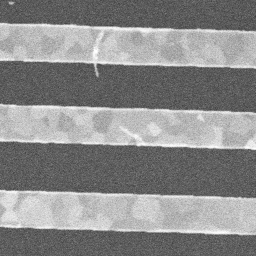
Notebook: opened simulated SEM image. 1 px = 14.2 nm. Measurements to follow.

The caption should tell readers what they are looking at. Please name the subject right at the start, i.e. lines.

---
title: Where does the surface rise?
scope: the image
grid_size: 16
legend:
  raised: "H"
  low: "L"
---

LLLLLLLLLLLLLLLL
LLLLLLLLLLLLLLLL
HHHHHHHHHHHHHHHH
HHHHHHHHHHHHHHHH
LLLLLLLLLLLLLLLL
LLLLLLLLLLLLLLLL
LLLLLLLLLLLLLLLL
HHHHHHHHHHHHHHHH
HHHHHHHHHHHHHHHH
LLLLLLLLLLLLLLLL
LLLLLLLLLLLLLLLL
LLLLLLLLLLLLLLLL
HHHHHHHHHHHHHHHH
HHHHHHHHHHHHHHHH
LLLLLLLLLLLLHHHH
LLLLLLLLLLLLLLLL